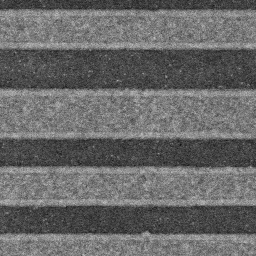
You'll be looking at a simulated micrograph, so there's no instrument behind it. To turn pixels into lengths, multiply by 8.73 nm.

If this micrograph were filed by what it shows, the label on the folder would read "one or a few lines or trenches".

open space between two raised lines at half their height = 309 nm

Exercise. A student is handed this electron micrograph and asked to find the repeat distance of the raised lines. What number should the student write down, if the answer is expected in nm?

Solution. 685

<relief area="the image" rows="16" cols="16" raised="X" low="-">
----------------
XXXXXXXXXXXXXXXX
XXXXXXXXXXXXXXXX
----------------
----------------
----------------
XXXXXXXXXXXXXXXX
XXXXXXXXXXXXXXXX
----------------
----------------
----------------
XXXXXXXXXXXXXXXX
XXXXXXXXXXXXXXXX
----------------
----------------
XXXXXXXXXXXXXXXX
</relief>